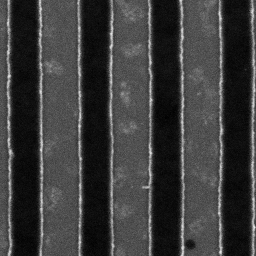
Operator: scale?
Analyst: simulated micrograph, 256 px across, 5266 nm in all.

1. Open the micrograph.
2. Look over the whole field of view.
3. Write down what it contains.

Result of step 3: one or a few lines or trenches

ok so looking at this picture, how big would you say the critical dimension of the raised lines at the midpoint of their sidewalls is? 682 nanometres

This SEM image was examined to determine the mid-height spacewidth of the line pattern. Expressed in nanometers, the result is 761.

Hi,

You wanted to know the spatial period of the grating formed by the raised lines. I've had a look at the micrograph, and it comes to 1.45 microns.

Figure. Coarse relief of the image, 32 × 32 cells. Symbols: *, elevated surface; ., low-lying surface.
.****.....****.....****.....****
.****.....****.....****....*****
.****.....****.....****.....****
.****.....****.....****.....****
.****.....****.....****.....****
.****.....****.....****.....****
.****.....****.....****.....****
.****.....****.....****.....****
.****.....****.....****.....****
.****.....****.....****.....****
.****.....****.....****.....****
.****.....****.....****.....****
.****.....****.....****.....****
.****.....****.....****.....****
.****.....****.....****.....****
.****.....****.....****.....****
.****.....****.....****.....****
.****.....****.....****.....****
.****.....****.....****.....****
.****.....****.....****.....****
.****.....****.....****.....****
.****.....****.....****....*****
.****.....****.....****....*****
.****.....****.....****....*****
.****.....****.....****....*****
.****.....****.....****....*****
.****.....****.....****....*****
.****.....****.....****....*****
.****.....****.....****....*****
.****.....****.....****.....****
.****.....****.....****....*****
.****.....****.....****....*****